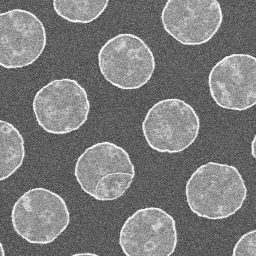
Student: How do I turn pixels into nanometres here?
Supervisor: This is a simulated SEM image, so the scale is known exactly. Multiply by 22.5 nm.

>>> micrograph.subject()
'raised bodies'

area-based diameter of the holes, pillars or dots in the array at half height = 1210 nm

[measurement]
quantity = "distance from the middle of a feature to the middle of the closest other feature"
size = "1760 nm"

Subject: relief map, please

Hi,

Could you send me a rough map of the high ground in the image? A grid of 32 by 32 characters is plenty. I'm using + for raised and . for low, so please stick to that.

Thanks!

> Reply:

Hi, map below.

.......++++++........++++++.....
.++....++++++.......++++++++....
+++++....+++........++++++++....
+++++................++++++.....
++++++.........+......++++......
++++++.......+++++..............
+++++........++++++.............
++++........+++++++.........++++
.............++++++........+++++
.............++++++.......++++++
......++++....++++........++++++
.....+++++................++++++
....+++++++................+++++
....+++++++........+++++.....++.
.....++++++.......++++++........
+....+++++........+++++++.......
++.....+..........+++++++.......
+++...............++++++........
+++........++++....++++.........
+++.......++++++................
+++.......++++++..........+.....
++........+++++++........+++++..
..........+++...........++++++..
..........++...........++++++++.
...++++................++++++++.
..++++++................++++++..
..++++++.........+++....+++++...
..+++++++.......++++++..........
..++++++.......+++++++..........
...++++........+++++++.........+
...............+++++++........++
................+++++........+++